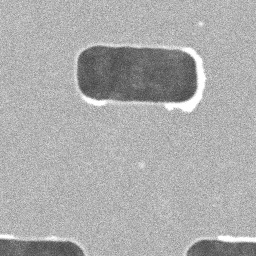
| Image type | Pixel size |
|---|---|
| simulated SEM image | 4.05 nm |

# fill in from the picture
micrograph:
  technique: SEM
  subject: holes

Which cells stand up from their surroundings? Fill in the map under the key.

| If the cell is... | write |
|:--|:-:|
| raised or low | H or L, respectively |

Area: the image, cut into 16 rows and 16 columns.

HHHHHHHHHHHHHHHH
HHHHHHHHHHHHHHHH
HHHHHHHHHHHHHHHH
HHHHHLLLLLLLHHHH
HHHHHLLLLLLLHHHH
HHHHHLLLLLLLHHHH
HHHHHHHHHHHHHHHH
HHHHHHHHHHHHHHHH
HHHHHHHHHHHHHHHH
HHHHHHHHHHHHHHHH
HHHHHHHHHHHHHHHH
HHHHHHHHHHHHHHHH
HHHHHHHHHHHHHHHH
HHHHHHHHHHHHHHHH
HHHHHHHHHHHHHHHH
LLLLLHHHHHHHLLLL